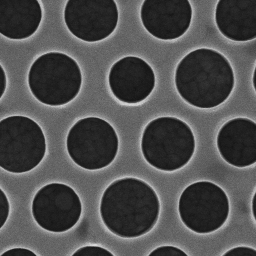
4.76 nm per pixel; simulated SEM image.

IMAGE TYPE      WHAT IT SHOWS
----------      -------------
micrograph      a regular array of holes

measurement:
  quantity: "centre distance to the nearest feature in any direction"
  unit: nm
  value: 347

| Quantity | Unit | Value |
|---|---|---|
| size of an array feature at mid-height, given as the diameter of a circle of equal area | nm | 247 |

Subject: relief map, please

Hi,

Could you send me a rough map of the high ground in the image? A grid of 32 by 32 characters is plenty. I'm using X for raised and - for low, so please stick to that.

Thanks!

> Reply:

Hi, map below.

-----XXX------XXXX------XXX-----
-----XXX-------XXX------XXX-----
-----XXX-------XXX------XXX-----
-----XXXX-----XXXX-----XXXX-----
X---XXXXX----XXXXXX----XXXXX----
XXXXXXXXXXXXXXXXXXXXXXXXXXXXXXXX
XXXXXXXXXXXXXXXXXXXXXXXX---XXXXX
XXXXX----XXXXXX---XXXXX-----XXXX
XXXX------XXXX-----XXX-------XXX
-XXX------XXXX-----XXX-------XXX
-XXX------XXXX-----XXX-------XXX
XXXX------XXXX-----XXX-------XXX
XXXXX----XXXXXX---XXXXX-----XXXX
XXXXXXXXXXXXXXXXXXXXXXXXXXXXXXXX
XXXXXXXXXXXXXXXXXXXXXXXXXXXXXXXX
-----XXXX-----XXXXX----XXXXX----
-----XXXX-----XXXX------XXX-----
------XX-------XXX------XXX-----
------XX-------XXX------XXX-----
-----XXXX-----XXXX------XXXX----
-----XXXXX----XXXXX----XXXXXX--X
XX-XXXXXXXXXXXXXXXXXXXXXXXXXXXXX
XXXXXXXXXXXXXXX--XXXXXXXXXXXXXXX
XXXXX----XXXX------XXXX----XXXXX
-XXX------XXX-------XXX-----XXXX
-XXX------XXX-------XX------XXXX
-XXX------XXX-------XX------XXXX
-XXXX-----XXX------XXXX-----XXXX
XXXXX----XXXXX-----XXXXX---XXXXX
XXXXXXXXXXXXXXX--XXXXXXXXXXXXXXX
XXXXXXXXXXXXXXXXXXXXXXXXXXXXXXXX
X---XXXXX-----XXXXX----XXXXX----